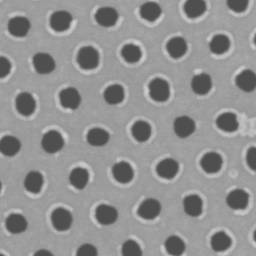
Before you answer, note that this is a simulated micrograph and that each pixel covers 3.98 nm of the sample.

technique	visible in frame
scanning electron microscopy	a regular array of holes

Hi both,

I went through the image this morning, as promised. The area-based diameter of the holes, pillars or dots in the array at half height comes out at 84.6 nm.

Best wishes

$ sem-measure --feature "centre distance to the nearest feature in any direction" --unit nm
174